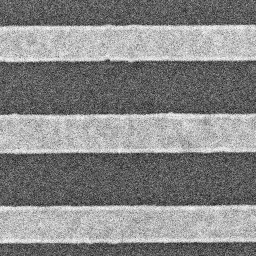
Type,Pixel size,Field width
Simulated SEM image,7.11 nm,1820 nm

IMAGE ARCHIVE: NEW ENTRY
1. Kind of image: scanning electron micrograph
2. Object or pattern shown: one or a few lines or trenches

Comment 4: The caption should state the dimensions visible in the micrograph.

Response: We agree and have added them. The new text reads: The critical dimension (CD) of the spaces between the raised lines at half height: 405 nm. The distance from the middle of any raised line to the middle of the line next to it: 90.5 px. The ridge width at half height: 33.3 px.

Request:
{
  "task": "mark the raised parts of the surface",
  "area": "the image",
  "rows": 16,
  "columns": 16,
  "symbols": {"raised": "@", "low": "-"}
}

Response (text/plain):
----------------
----------------
@@@@@@@@@@@@@@@@
@@@@@@@@@@@@@@@@
----------------
----------------
----------------
@@@@@@@@@@@@@@@@
@@@@@@@@@@@@@@@@
@---------------
----------------
----------------
----------------
@@@@@@@@@@@@@@@@
@@@@@@@@@@@@@@@@
----------------